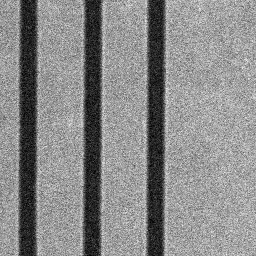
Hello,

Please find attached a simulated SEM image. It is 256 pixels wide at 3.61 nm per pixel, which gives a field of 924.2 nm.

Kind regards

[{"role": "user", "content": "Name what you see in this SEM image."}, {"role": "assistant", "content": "one or a few lines or trenches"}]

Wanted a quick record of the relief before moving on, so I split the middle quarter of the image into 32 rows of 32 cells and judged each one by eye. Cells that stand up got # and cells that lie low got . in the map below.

#####....############....#######
#####....############....#######
#####....############....#######
#####....############....#######
#####.....###########....#######
#####.....###########....#######
#####.....###########....#######
#####....############....#######
#####....############....#######
#####....############....#######
#####....############....#######
#####....############....#######
#####....############....#######
#####....############....#######
#####....############....#######
#####....############....#######
#####.....###########....#######
#####.....###########....#######
#####.....###########....#######
#####.....###########....#######
#####.....###########....#######
#####.....###########....#######
#####.....###########....#######
#####.....###########....#######
#####....############....#######
#####....############....#######
#####....############....#######
#####....############....#######
#####....############....#######
#####....############....#######
#####....############....#######
#####....############....#######